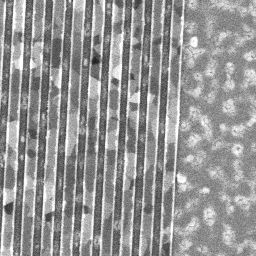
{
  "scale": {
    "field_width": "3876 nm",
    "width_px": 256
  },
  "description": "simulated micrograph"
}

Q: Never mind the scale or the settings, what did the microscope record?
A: parallel lines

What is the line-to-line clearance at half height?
128 nanometres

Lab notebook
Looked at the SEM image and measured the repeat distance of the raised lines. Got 0.3 microns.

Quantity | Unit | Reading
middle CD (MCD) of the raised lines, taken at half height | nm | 166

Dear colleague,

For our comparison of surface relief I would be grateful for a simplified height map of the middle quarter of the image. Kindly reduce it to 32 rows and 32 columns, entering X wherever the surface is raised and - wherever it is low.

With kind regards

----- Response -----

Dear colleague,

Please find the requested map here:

--XX---XX--XXX---XX---XX--XXX---
--XX---XX--XXX--XXX---XX--XXX---
--XX--XXX--XXX--XXX--XXX--XXX---
--XX--XXX--XXX--XXX--XXX--XXX---
--XX--XXX--XXX--XXX--XXX--XXX---
-XXX--XXX--XXX--XXX--XXX--XXX---
-XXX--XXX--XXX--XXX--XXX--XXX---
-XXX--XXX--XXX--XXX--XXX--XXX---
-XXX--XXX--XXX--XXX--XXX--XXX---
-XXX--XXX--XXX--XXX--XXX--XXX---
-XXX--XXX--XXX--XXX--XXX--XX----
-XXX--XXX--XXX--XX---XXX--XXX---
-XXX--XXX--XXX--XX---XXX--XXX---
-XXX--XXX--XXX--XXX--XX---XXX---
-XXX--XXX--XXX--XXX--XX---XXX---
-XX---XXX--XXX--XX---XX---XX----
-XX---XXX--XXX--XX---XX---XX----
-XX---XXX--XXX--XX---XX---XX----
-XX---XX---XX---XX---XX---XX----
-XX---XX--XXX---XX---XX--XXX----
XXX---XX--XXX--XXX---XX--XXX----
-XX--XXX---XX--XXX---XX--XXX----
-XX--XXX---XX--XXX--XXX--XXX----
-XX--XXX--XXX--XXX--XXX--XXX----
XXX--XXX--XXX--XXX--XXX--XXX----
XXX--XXX--XXX--XXX--XXX--XXX----
XXX--XXX--XXX--XXX--XXX--XXX----
XXX--XXX--XXX--XXX--XXX--XXX----
XXX--XXX--XXX--XXX--XXX--XXX-X--
XXX--XXX--XXX--XXX--XX---XX-----
XXX--XXX--XXX--XX---XX---XXX----
XXX--XXX--XXX--XX---XX---XXX----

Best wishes